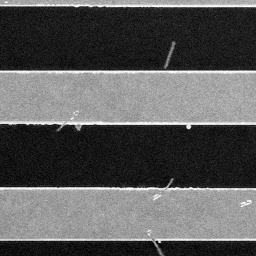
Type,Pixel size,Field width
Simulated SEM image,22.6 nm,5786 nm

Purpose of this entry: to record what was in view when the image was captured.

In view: lines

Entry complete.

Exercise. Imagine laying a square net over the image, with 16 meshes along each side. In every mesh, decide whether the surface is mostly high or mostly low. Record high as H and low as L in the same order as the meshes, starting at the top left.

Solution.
LLLLLLLLLLLLLLLL
LLLLLLLLLLLLLLLL
LLLLLLLLLLLLLLLL
LLLLLLLLLLLLLLLL
HHHHHHHHHHHHHHHH
HHHHHHHHHHHHHHHH
HHHHHHHHHHHHHHHH
HHHHHHHHHHHHHHHH
LLLLLLLLLLLLLLLL
LLLLLLLLLLLLLLLL
LLLLLLLLLLLLLLLL
LLLLLLLLLLLLLLLL
HHHHHHHHHHHHHHHH
HHHHHHHHHHHHHHHH
HHHHHHHHHHHHHHHH
LLLLLLLLLLLLLLLL